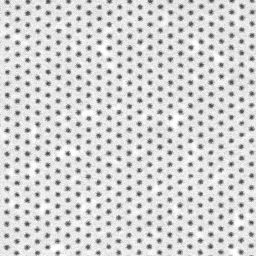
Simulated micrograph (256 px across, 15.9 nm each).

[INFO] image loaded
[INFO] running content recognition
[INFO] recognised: a regular array of holes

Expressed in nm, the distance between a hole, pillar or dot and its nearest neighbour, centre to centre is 184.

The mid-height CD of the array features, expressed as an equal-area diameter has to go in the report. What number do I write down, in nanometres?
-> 102